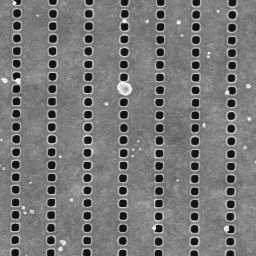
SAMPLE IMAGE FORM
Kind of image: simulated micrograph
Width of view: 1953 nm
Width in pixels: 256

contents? a regular array of holes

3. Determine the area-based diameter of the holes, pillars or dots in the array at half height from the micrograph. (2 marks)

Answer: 8.22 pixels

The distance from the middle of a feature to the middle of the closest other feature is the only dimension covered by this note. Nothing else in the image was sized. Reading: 94.7 nanometers